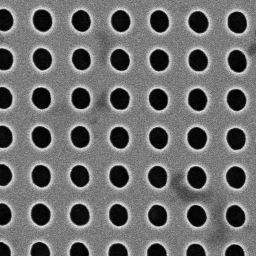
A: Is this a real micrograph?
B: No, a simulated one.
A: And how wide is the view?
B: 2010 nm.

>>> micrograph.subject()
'a regular array of holes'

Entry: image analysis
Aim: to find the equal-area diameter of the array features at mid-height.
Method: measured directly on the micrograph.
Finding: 160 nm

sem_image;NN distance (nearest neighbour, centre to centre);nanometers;303